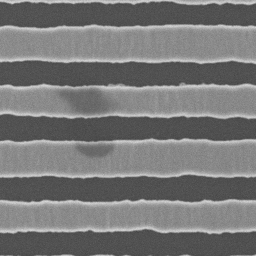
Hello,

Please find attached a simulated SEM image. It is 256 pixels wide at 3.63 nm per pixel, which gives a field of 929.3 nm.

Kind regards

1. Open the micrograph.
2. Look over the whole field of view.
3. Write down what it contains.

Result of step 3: lines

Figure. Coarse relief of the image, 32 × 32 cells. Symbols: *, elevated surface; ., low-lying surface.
.......................***.*.***
................................
................................
*****.**************************
********************************
********************************
********************************
***..***************************
................................
................................
................................
********************************
********************************
********************************
....**********.*****************
................................
................................
..................**.*****....**
********************************
********************************
********************************
********************************
................................
................................
................................
********************************
********************************
********************************
********************************
................................
................................
................................